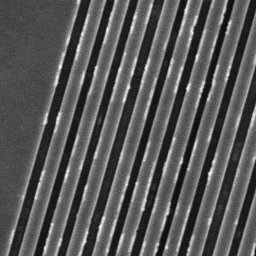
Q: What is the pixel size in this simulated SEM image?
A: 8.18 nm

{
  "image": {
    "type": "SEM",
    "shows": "parallel lines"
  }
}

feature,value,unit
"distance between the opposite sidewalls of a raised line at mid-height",117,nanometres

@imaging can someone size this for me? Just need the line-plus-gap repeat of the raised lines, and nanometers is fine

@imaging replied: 190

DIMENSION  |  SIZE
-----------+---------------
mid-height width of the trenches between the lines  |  77.7 nm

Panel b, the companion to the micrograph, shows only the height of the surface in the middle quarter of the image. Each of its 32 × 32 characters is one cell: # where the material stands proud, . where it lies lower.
..####..####..####..####..####..
..###...###...####..####..####..
..###...###..####...####..###...
.####..####..####...###..####...
.####..###...###...####..####..#
.###...###..####...####..####..#
.###..####..####...####..###...#
####..####..####...###..####...#
###...###...####..####..####..##
###...###...###...####..###...##
###..####..####...###..####...##
###..###...###...####..####..###
##...###...###...####..####..###
##..####..####...####..###...###
##..####..####...###..####...###
#...###...###...####..####..####
#...###...###...####..###...####
#..####..####...###..####...###.
#..####..####..####..####..####.
...###...###...####..####..####.
..####..####...####..###...####.
..####..####...###..####..####..
..###...###...####..####..####..
..###..####...####..###...####..
.####..####...###..####..#####.#
.####..###...####..####..####..#
.###...###...####..####..####..#
.###..####...####..###...####..#
####..####...###..####...###..##
###...###...####..####..####..##
###..####...####..###...####..##
###..####...###..####...###..###